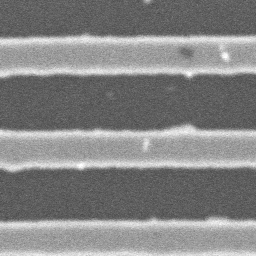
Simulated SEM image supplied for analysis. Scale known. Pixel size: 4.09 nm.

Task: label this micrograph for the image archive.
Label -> lines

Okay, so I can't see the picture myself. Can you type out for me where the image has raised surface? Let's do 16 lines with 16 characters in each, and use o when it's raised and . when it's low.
................
................
oooooooooooooooo
oooooooooooooooo
oooooooooooooooo
................
................
................
oooooooooooooooo
oooooooooooooooo
oo..............
................
................
................
oooooooooooooooo
oooooooooooooooo